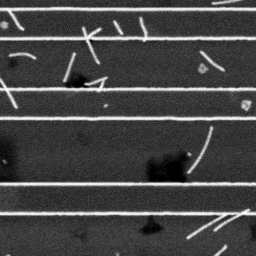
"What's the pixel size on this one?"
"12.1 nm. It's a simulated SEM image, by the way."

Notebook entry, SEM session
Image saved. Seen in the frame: lines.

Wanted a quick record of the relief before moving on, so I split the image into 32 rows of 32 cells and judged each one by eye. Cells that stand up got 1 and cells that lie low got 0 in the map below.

00000000000000000000000000000000
11111111111111111111111111111111
11111111111111111111111111111111
11111111111111111111111111111111
11111111111111111111111111111111
00000000000000000000000000000000
00000000000000000000000000000000
00000000000000000000000000000000
00000000000000000000000000000000
00000000000000000000000000000000
00000000000000000000000000000000
11111111111111111111111111111111
11111111111111111111111111111111
11111111111111111111111111111111
11111111111111111111111111111111
00000000000000000000000000000000
00000000000000000000000000000000
00000000000000000000000000000000
00000000000000000000000000000000
00000000000000000000000000000000
00000000000000000000000000000000
00000000000000000000000000000000
00000000000000000000000000000000
11111111111111111111111111111111
11111111111111111111111111111111
11111111111111111111111111111111
11111111111111111111111111111111
00000000000000000000000000000000
00000000000000000000000000000000
00000000000000000000000000000000
00000000000000000000000000000000
00000000000000000000000000000000